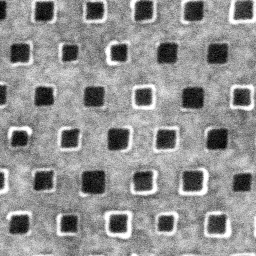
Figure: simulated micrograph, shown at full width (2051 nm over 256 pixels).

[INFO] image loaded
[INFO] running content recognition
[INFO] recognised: a regular array of raised bodies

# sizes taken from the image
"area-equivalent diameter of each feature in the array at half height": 0.209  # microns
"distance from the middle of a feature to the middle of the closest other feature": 387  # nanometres